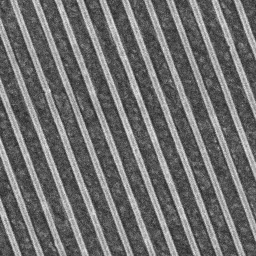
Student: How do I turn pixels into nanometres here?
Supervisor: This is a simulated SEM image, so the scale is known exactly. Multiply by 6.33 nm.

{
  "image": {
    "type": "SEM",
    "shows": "parallel lines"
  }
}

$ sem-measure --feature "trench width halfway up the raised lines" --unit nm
98.7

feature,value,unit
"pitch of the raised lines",133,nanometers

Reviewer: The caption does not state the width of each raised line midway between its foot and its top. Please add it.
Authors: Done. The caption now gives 34.9 nanometres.